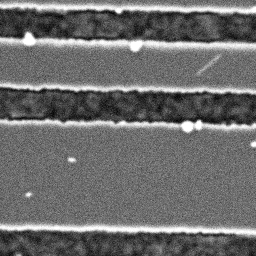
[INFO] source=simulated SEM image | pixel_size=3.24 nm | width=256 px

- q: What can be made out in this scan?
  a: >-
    lines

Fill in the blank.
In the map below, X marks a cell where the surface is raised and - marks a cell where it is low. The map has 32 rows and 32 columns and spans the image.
XXXXXXXXXXXXXXXXXXXXXXXXXXXXXXXX
------------------------------X-
--------------------------------
--------------------------------
---X----------------------------
XXXXXXXXXXXXXXXXXXXXXXXXXXXXXXXX
XXXXXXXXXXXXXXXXXXXXXXXXXXXXXXXX
XXXXXXXXXXXXXXXXXXXXXXXXXXXXXXXX
XXXXXXXXXXXXXXXXXXXXXXXXXXXXXXXX
XXXXXXXXXXXXXXXXXXXXXXXXXXXXXXXX
XXXXXXXXXXXXXXXXXXXXXXXXXXXXXXXX
-----------------------X--XX-XXX
--------------------------------
--------------------------------
--------------------------------
XXXXXXXXXXXXXXXXXXXXXX-XXX------
XXXXXXXXXXXXXXXXXXXXXXXXXXXXXXXX
XXXXXXXXXXXXXXXXXXXXXXXXXXXXXXXX
XXXXXXXXXXXXXXXXXXXXXXXXXXXXXXXX
XXXXXXXXXXXXXXXXXXXXXXXXXXXXXXXX
XXXXXXXXXXXXXXXXXXXXXXXXXXXXXXXX
XXXXXXXXXXXXXXXXXXXXXXXXXXXXXXXX
XXXXXXXXXXXXXXXXXXXXXXXXXXXXXXXX
XXXXXXXXXXXXXXXXXXXXXXXXXXXXXXXX
XXXXXXXXXXXXXXXXXXXXXXXXXXXXXXXX
XXXXXXXXXXXXXXXXXXXXXXXXXXXXXXXX
XXXXXXXXXXXXXXXXXXXXXXXXXXXXXXXX
XXXXXXXXXXXXXXXXXXXXXXXXXXXXXXXX
XXXXXXXXXXXXXXXXXXXXXXXXXXXXXXXX
--------------------------------
--------------------------------
--------------------------------